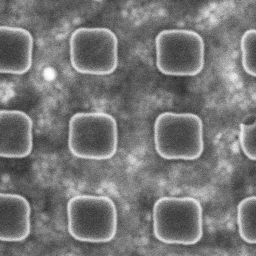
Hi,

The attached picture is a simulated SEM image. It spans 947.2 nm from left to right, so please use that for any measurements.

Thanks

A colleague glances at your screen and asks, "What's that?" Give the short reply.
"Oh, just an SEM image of raised bodies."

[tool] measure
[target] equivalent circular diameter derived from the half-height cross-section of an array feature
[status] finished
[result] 0.185 micrometres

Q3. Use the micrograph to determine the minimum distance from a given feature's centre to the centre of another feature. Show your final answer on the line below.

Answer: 309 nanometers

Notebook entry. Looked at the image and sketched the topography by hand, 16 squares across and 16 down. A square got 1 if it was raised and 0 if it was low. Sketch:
0000000000000000
0000000000000000
1100111000111001
1100111000111001
1000011000110000
0000000000000000
0000000000000000
1100011000110000
1100111000111001
1100011000111001
0000000000000000
0000000000000000
1100011000110001
1100111000111001
1100111000111001
0000000000000000